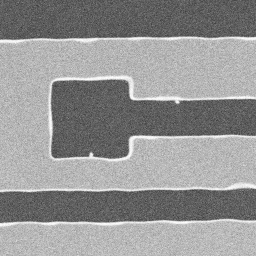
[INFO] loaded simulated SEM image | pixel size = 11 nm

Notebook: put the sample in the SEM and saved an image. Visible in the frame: groups of lines, slits or small figures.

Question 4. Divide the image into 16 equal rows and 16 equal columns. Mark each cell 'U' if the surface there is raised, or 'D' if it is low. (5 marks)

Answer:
DDDDDDDDDDDDDDDD
DDDDDDDDDDDDDDDD
DUUUUUUUUUUUUUUU
UUUUUUUUUUUUUUUU
UUUUUUUUUUUUUUUU
UUUDDDDDUUUUUUUU
UUUDDDDDDDDDDDDD
UUUDDDDDDDDDDDDD
UUUDDDDDDDDDDDDD
UUUDDDDDUUUUUUUU
UUUUUUUUUUUUUUUU
UUUUUUUUUUUUUUUU
DDDDDDDDDDDDDDDD
DDDDDDDDDDDDDDDD
UUUUUUUUUUUUUUUU
UUUUUUUUUUUUUUUU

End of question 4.